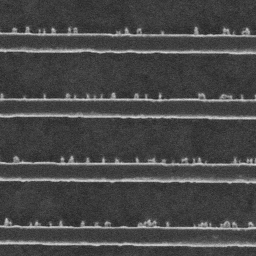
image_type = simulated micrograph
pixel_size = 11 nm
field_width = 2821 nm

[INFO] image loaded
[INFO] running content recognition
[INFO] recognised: lines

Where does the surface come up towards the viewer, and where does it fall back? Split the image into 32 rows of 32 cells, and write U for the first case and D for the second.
DDDDDDDDDDDDDDDDDDDDDDDDDDDDDDDD
DDDDDDDDDDDDDDDDDDDDDDDDDDDDDDDD
DDDDDDDDDDDDDDDDDDDDDDDDDDDDDDDD
DDDDDDDDDDDDDDDDDDDDDDDDDDDDDDDD
UUUUUUUUUUUUUUUUUUUUUUUUUUUUUUUU
UUUUUUUUUUUUUUUUUUUUUUUUUUUUUUUU
DDDDDDDDDDDDDDDDDDDDUUUUUUUUUUUU
DDDDDDDDDDDDDDDDDDDDDDDDDDDDDDDD
DDDDDDDDDDDDDDDDDDDDDDDDDDDDDDDD
DDDDDDDDDDDDDDDDDDDDDDDDDDDDDDDD
DDDDDDDDDDDDDDDDDDDDDDDDDDDDDDDD
DDDDDDDDDDDDDDDDDDDDDDDDDDDDDDDD
UUUUUUUUUUUUUUUUUUUDDUUUUDDDDDDD
UUUUUUUUUUUUUUUUUUUUUUUUUUUUUUUU
UUUUDDUDUUUUUUUUUUUUUUUUUUUUUUUU
DDDDDDDDDDDDDDDDDDDDDDDDDDDDDDDD
DDDDDDDDDDDDDDDDDDDDDDDDDDDDDDDD
DDDDDDDDDDDDDDDDDDDDDDDDDDDDDDDD
DDDDDDDDDDDDDDDDDDDDDDDDDDDDDDDD
DDDDDDDDDDDDDDDDDDDDDDDDDDDDDDDD
UUUUUUUUUUUUUUUUUUUUUDDDUUDDDDUD
UUUUUUUUUUUUUUUUUUUUUUUUUUUUUUUU
UUUUUUUUUUUUUUUUUUUUUUUUUUUUUUUU
DDDDDDDDDDDDDDDDDDDDDDDDDDDDDDDD
DDDDDDDDDDDDDDDDDDDDDDDDDDDDDDDD
DDDDDDDDDDDDDDDDDDDDDDDDDDDDDDDD
DDDDDDDDDDDDDDDDDDDDDDDDDDDDDDDD
DDDDDDDDDDDDDDDDDDDDDDDDDDDDDDDD
UUUUUUUUUUUUUUUUUUUUUUUUUUUDDDDU
UUUUUUUUUUUUUUUUUUUUUUUUUUUUUUUU
DDDDDDUDUUUUUUUUUUUUUUUUUUUUUUUU
DDDDDDDDDDDDDDDDDDDDDDDDDDDDDDDD